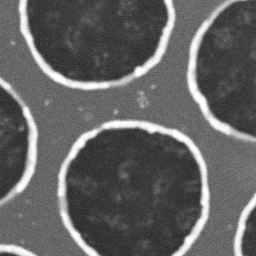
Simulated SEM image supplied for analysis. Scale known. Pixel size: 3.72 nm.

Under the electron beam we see holes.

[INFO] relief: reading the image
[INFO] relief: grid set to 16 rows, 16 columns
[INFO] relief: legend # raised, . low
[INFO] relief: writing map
##........####..
##........###...
##........##....
##........##....
###.....####....
############....
.############...
..############..
..####.....####.
..###.......####
..##.........###
.###.........###
####.........###
####.........##.
#####.......###.
######.....####.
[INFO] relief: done